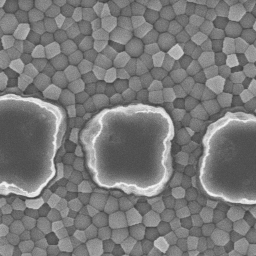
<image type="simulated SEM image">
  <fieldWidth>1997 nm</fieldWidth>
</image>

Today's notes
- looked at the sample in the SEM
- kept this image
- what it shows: raised bodies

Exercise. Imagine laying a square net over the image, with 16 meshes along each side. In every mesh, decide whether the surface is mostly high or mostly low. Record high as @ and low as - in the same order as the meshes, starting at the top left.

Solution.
----------------
----------------
----------------
----------------
----------------
----------------
@@@-------------
@@@@--@@@@@---@@
@@@@--@@@@@--@@@
@@@---@@@@@--@@@
@@@---@@@@---@@@
@@@---@@@@---@@@
--------------@@
----------------
----------------
----------------